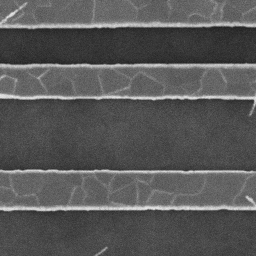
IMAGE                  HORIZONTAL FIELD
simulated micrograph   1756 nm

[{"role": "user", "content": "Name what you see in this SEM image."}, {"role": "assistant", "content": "lines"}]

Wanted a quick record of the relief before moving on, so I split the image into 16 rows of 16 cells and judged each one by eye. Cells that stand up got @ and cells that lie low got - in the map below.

@@@@@@@@@@@@@@@@
@@@@@@@@@@@@@@@@
----------------
----------------
@@@@@@@@@@@@@@@@
@@@@@@@@@@@@@@@@
----------------
----------------
----------------
----------------
----------------
@@@@@@@@@@@@@@@@
@@@@@@@@@@@@@@@@
----------------
----------------
----------------